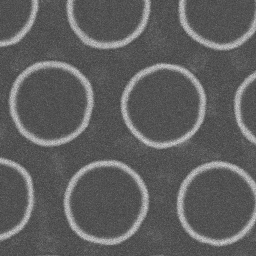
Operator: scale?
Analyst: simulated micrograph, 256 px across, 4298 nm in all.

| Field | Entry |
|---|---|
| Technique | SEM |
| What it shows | raised bodies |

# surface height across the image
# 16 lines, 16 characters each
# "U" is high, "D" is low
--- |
UUDDUUUUUDDUUUUU
UUDDDUUUUDDDUUUU
UDDDDUUUDDDDDUUD
DDDDDDDDDDDDDDDD
DDUUUDDDDUUUDDDD
DUUUUUDDUUUUDDDU
DUUUUUDDUUUUUDDU
DUUUUDDDUUUUUDDU
DDUUUDDDDUUUDDDD
DDDDDDDDDDDDDDDD
UDDDDUUUDDDDDUUD
UUDDUUUUUDDDUUUU
UUDDUUUUUDDUUUUU
UUDDUUUUUDDUUUUU
UDDDDUUUDDDDUUUD
DDDDDDDDDDDDDDDD